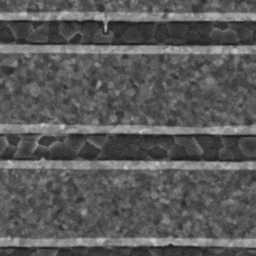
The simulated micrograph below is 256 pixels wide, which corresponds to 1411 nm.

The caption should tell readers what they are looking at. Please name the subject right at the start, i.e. one or a few lines or trenches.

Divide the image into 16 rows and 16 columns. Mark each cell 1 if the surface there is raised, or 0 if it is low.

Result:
1111111111111111
0000000000000000
0000000000000000
1111111111111111
1111111111111111
1111111111111111
1111111111111111
1111111111111111
0000000000000000
0000000000000000
1111111111111111
1111111111111111
1111111111111111
1111111111111111
1111111111111111
0000000000000000